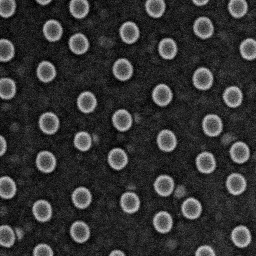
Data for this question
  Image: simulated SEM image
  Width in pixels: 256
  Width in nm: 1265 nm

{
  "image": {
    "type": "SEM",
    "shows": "a regular array of raised bodies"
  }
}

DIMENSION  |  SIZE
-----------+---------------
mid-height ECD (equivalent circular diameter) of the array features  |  93.5 nm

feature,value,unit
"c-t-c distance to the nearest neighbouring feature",186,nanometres